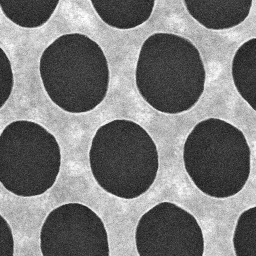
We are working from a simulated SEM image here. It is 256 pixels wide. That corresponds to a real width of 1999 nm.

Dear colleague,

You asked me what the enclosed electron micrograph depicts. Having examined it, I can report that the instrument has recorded holes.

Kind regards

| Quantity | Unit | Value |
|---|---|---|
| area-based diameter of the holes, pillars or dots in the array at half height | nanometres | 578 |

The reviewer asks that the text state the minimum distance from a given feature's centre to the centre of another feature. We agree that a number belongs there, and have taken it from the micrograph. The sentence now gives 740 nm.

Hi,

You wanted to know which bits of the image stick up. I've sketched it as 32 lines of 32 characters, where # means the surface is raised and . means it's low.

.......#####.......####........#
.......#####.......#####.......#
#.....#######.....#######.....##
###############..#########...###
########...########...##########
######......######......######..
#####........####........####...
.####........####........####...
.####.........###.........###...
..###.........###.........###...
..###.........###.........###...
.#####.......####........#####..
.#####.......#####.......######.
########....#######.....#######.
################################
#....########....########....###
......######......######......##
.......#####.......####........#
.......####.........###........#
........###.........###........#
.......####.........###........#
.......####.........###........#
.......#####.......#####.......#
#.....#######......######.....##
##..###########..#########...###
########..##########..##########
######......######.....#######..
.#####.......####........#####..
.####........####........####...
..###........####........####...
..###........####.........###...
..###.........###........####...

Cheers